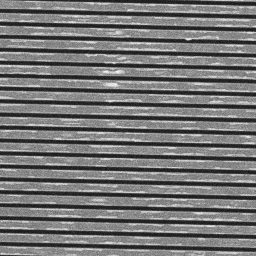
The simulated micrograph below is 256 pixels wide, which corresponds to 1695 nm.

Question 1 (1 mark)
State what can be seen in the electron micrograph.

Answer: parallel lines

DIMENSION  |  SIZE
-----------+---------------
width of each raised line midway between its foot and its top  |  0.0571 microns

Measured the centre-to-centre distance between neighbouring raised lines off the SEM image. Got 85.7 nm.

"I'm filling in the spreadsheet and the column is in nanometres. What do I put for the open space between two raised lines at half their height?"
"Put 25.6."